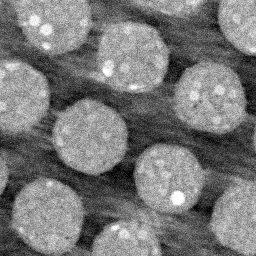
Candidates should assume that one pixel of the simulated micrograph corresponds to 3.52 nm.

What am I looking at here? raised bodies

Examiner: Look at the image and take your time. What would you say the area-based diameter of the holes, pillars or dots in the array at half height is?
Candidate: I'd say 70.1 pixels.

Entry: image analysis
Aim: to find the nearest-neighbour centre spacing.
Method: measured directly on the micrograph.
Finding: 0.312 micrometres